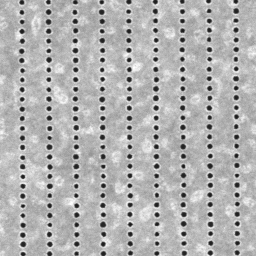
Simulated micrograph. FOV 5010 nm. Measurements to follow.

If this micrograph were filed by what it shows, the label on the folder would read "a regular array of holes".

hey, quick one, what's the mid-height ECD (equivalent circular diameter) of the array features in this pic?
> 0.106 microns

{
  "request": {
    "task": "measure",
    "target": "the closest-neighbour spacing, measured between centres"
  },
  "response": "186 nm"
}